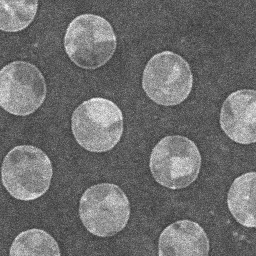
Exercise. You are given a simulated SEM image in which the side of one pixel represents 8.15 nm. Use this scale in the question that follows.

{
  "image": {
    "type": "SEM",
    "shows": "raised bodies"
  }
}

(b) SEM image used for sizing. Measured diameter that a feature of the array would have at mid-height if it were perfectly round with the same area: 423 nanometres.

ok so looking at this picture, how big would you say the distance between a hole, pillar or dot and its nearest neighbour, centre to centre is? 682 nanometers